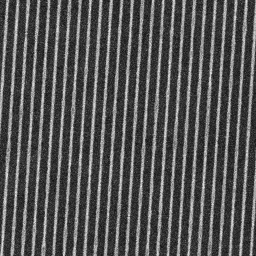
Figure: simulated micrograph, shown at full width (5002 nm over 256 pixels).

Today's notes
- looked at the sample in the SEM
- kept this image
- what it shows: parallel lines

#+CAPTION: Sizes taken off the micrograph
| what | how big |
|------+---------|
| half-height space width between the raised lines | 158 nanometres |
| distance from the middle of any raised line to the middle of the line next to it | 202 nm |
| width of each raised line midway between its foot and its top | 41.4 nm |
